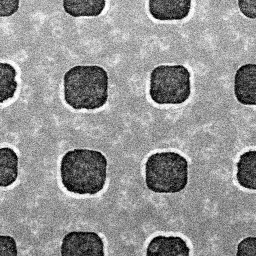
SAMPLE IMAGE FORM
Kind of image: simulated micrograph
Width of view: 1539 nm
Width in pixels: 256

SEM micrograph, holes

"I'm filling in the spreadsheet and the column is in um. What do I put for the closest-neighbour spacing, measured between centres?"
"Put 0.502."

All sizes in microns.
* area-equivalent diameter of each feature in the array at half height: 0.275